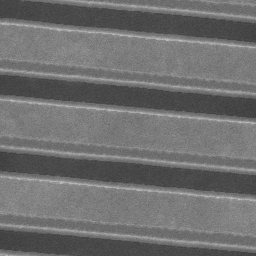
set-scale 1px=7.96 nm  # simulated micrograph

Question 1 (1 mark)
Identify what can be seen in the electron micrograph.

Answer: lines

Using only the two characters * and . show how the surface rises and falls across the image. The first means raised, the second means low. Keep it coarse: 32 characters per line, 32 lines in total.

............********************
......................**********
................................
********........................
*******************.............
******************************..
********************************
********************************
********************************
......**************************
.................***************
..........................******
***.............................
*************...................
*************************.......
********************************
********************************
********************************
********************************
...........*********************
.....................***********
................................
*******.........................
******************..............
****************************....
********************************
********************************
********************************
.*******************************
..............******************
.......................*********
................................